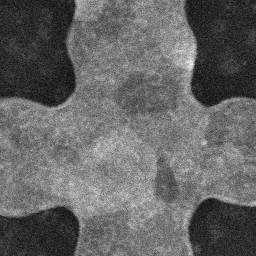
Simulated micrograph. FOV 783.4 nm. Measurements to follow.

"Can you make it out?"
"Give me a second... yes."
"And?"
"holes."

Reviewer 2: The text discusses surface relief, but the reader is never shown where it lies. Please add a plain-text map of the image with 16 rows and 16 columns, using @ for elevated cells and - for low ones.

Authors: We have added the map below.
-----@@@@@@-----
-----@@@@@@@----
----@@@@@@@@----
----@@@@@@@@----
-----@@@@@@@----
-----@@@@@@@----
@@--@@@@@@@@@-@@
@@@@@@@@@@@@@@@@
@@@@@@@@@@@@@@@@
@@@@@@@@@@@@@@@@
@@@@@@@@@@@@@@@@
@@@@@@@@@@@@@@@@
@@@@@@@@@@@@@-@@
@@---@@@@@@@----
-----@@@@@@@----
-----@@@@@@@----